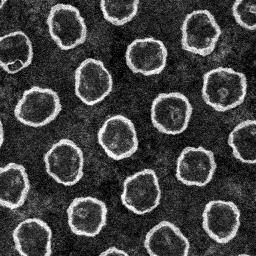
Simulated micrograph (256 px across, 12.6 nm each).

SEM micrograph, a regular array of raised bodies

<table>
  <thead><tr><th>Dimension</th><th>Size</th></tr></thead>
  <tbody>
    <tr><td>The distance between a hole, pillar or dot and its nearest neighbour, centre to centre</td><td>739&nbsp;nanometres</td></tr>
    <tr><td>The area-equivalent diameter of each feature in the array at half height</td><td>474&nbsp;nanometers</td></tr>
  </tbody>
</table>